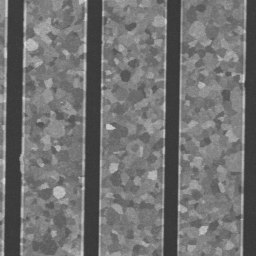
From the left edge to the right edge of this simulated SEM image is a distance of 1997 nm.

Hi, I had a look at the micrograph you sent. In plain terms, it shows one or a few lines or trenches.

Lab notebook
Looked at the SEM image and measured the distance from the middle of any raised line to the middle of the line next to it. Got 616 nm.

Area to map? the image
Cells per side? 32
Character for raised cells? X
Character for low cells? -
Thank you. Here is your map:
X--XXXXXXXX--XXXXXXXX--XXXXXXXX-
X--XXXXXXXX--XXXXXXXX--XXXXXXXX-
X--XXXXXXXX--XXXXXXXX--XXXXXXXX-
X--XXXXXXXX--XXXXXXXX--XXXXXXXX-
X--XXXXXXXX--XXXXXXXX--XXXXXXX--
X--XXXXXXXX--XXXXXXXX--XXXXXXX--
X--XXXXXXXX--XXXXXXXX--XXXXXXX--
X--XXXXXXXX--XXXXXXXX--XXXXXXX--
X--XXXXXXXX--XXXXXXXX--XXXXXXX--
X--XXXXXXXX--XXXXXXXX--XXXXXXX--
X--XXXXXXXX--XXXXXXXX--XXXXXXX--
X--XXXXXXX---XXXXXXXX--XXXXXXX--
X--XXXXXXX---XXXXXXXX--XXXXXXX--
X--XXXXXXX---XXXXXXXX--XXXXXXX--
X--XXXXXXX---XXXXXXXX--XXXXXXX--
---XXXXXXX---XXXXXXXX--XXXXXXX--
---XXXXXXX---XXXXXXX---XXXXXXX--
---XXXXXXX---XXXXXXX---XXXXXXX--
X--XXXXXXX---XXXXXXX--XXXXXXXX--
X--XXXXXXX---XXXXXXX--XXXXXXXX--
X--XXXXXXX---XXXXXXX--XXXXXXXX--
---XXXXXXX---XXXXXXX--XXXXXXXX--
---XXXXXXX---XXXXXXX--XXXXXXXX--
---XXXXXXX---XXXXXXX--XXXXXXXX--
---XXXXXXX---XXXXXXX--XXXXXXXX--
---XXXXXXX---XXXXXXX--XXXXXXXX--
---XXXXXXX---XXXXXXX--XXXXXXXX--
---XXXXXXX---XXXXXXX--XXXXXXXX--
---XXXXXXX---XXXXXXX--XXXXXXXX--
---XXXXXXX---XXXXXXX--XXXXXXXX--
---XXXXXXX--XXXXXXXX--XXXXXXXX--
---XXXXXXX--XXXXXXXX--XXXXXXXX--